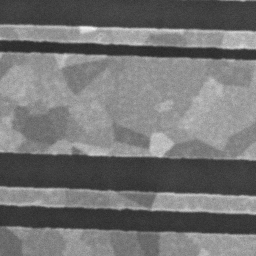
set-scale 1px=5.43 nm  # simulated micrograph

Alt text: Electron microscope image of lines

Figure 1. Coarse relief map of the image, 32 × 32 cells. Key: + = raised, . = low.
................................
................................
................................
+++++++++++.....................
++++++++++++++++++++++++++++++++
................++++++++++++++++
................................
+++++++++++++++++++++++++++++...
++++++++++++++++++++++++++++++++
++++++++++++++++++++++++++++++++
++++++++++++++++++++++++++++++++
++++++++++++++++++++++++++++++++
++++++++++++++++++++++++++++++++
++++++++++++++++++++++++++++++++
++++++++++++++++++++++++++++++++
++++++++++++++++++++++++++++++++
++++++++++++++++++++++++++++++++
++++++++++++++++++++++++++++++++
++++++++++++++++++++++++++++++++
...................+++++++++++++
................................
................................
................................
+...............................
++++++++++++++++++++++++++++....
.+++++++++++++++++++++++++++++++
............................++++
................................
+++.............................
++++++++++++++++++++++++++++++++
++++++++++++++++++++++++++++++++
++++++++++++++++++++++++++++++++